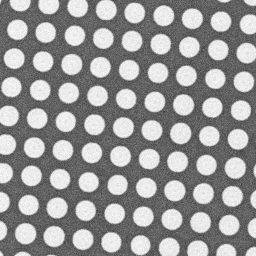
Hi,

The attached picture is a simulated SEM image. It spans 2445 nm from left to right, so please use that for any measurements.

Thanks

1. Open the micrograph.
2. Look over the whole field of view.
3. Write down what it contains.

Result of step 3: an array of small figures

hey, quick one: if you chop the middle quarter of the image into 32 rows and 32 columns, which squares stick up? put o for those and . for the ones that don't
oooo...ooooo..oooo....ooo.......
oooo...oooo...ooooo..ooooo...ooo
.oo....oooo...ooooo..ooooo..oooo
...............ooo...ooooo..oooo
.......................o.....ooo
ooo.............................
oooo..oooo.....o................
oooo..ooooo..ooooo...ooo........
ooo...ooooo..ooooo..ooooo...oooo
oo....oooo...ooooo..ooooo..ooooo
..............ooo...ooooo..ooooo
.....................ooo....oooo
oo...........................oo.
ooo...ooo.....o.................
ooo..ooooo...oooo....oo.........
ooo..ooooo..ooooo...oooo...oooo.
oo....oooo..ooooo...oooo...ooooo
.......oo....oooo...oooo...ooooo
....................oooo...oooo.
o...........................ooo.
oo...oooo.......................
oo...oooo...oooo....oo..........
oo...oooo...ooooo..oooo....ooo..
o....oooo...ooooo..ooooo..ooooo.
......oo....oooo...ooooo..ooooo.
..............o.....ooo...ooooo.
...........................ooo..
o....oo.........................
o...oooo....ooo.................
o...ooooo..ooooo...oooo....oo...
o...oooo...ooooo..ooooo..ooooo..
.....ooo...oooo...ooooo..ooooo..